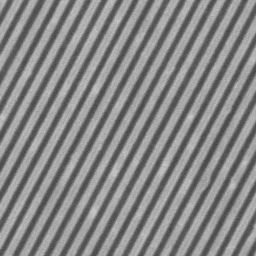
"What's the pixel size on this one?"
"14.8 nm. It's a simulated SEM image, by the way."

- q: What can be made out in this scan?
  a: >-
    parallel lines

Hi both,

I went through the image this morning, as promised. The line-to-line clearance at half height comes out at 113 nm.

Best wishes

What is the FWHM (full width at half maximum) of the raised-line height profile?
99.5 nm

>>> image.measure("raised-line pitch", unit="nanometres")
204